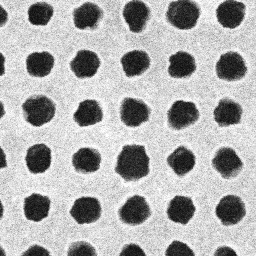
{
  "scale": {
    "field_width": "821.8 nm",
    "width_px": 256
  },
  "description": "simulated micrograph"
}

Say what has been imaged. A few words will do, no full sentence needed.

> a regular array of holes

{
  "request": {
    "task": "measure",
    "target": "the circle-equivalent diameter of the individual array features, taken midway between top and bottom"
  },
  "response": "92 nm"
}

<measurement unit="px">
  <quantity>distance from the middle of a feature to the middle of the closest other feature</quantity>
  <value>46.4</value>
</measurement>